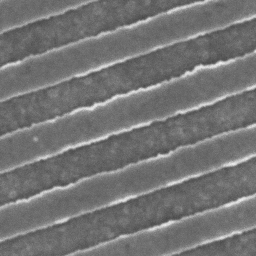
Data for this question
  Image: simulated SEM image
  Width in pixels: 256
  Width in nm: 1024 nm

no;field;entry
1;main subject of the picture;one or a few lines or trenches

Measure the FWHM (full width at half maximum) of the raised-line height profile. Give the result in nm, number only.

133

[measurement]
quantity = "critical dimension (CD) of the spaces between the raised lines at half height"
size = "129 nanometres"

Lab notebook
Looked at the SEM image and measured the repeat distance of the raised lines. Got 266 nanometres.